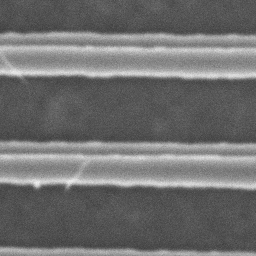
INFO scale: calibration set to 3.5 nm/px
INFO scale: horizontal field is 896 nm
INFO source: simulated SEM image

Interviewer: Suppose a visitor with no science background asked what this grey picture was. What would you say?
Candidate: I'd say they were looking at lines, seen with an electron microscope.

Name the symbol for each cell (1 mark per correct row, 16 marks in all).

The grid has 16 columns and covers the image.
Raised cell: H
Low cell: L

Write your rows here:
LLLLLLLLLLLLLLLL
LLLLLLLLLLLLLLLL
HHHHHHHHHHHHHHHH
HHHHHHHHHHHHHHHH
HHHHHHHHHHHHHHHH
LLLLLLLLLLLLLLLL
LLLLLLLLLLLLLLLL
LLLLLLLLLLLLLLLL
LLLLLLLLLLLLLLLL
HHHHHHHHHHHHHHHH
HHHHHHHHHHHHHHHH
LLHLLLLLLHHHHHHH
LLLLLLLLLLLLLLLL
LLLLLLLLLLLLLLLL
LLLLLLLLLLLLLLLL
LLLLLLLLLLLLLLLL